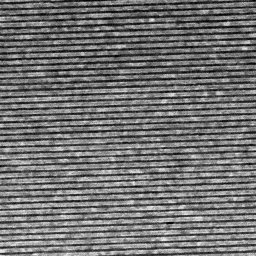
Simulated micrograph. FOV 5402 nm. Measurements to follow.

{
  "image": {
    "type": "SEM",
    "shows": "parallel lines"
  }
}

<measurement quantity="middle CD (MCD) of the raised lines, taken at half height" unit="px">3.37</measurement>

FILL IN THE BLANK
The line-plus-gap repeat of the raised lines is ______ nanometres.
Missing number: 132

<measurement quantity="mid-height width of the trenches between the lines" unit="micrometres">0.0606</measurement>